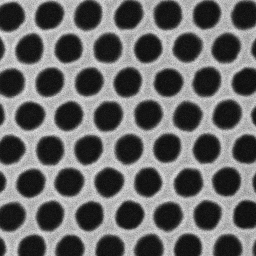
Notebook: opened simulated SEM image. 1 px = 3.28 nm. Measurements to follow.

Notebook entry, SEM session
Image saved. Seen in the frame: a regular array of holes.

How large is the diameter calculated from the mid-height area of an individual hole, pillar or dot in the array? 89.4 nanometers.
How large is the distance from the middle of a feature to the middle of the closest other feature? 126 nm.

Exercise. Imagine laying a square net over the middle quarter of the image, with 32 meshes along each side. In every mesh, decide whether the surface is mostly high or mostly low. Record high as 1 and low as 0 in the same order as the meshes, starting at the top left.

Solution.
11111111111111111111111111111111
11111000111111100011111110011111
11110000011110000001111000000111
11100000001110000001111000000011
11100000001100000001111000000011
11100000011110000001111000000011
11100000011110000001111000000111
11110001111111000111111100001111
11111111111111111111111111111111
10111111111111111111000111111111
00001111100000111110000011111000
00001111000000111100000011110000
00000111000000011100000001110000
00001111000000111100000011100000
00001111000000111100000011110000
00011111000001111110000111110000
01111111110011111111111111111100
11111111111111111111111111011111
11111000111111100001111100000111
11100000011111000001111000000111
11100000001110000000111000000111
11100000011110000000110000000111
11100000011110000001111000000111
11100000011111000001111000001111
11110001111111100111111111111111
11111111111111111111111111111111
00011111110001111111000111111100
00001111100000111110000111111000
00000111000000011100000011110000
00000111000000011100000011110000
00000111000000011100000011110000
00001111000000111100000011110000